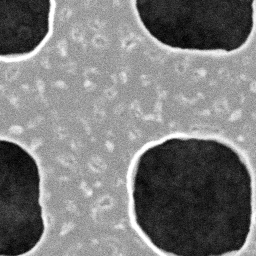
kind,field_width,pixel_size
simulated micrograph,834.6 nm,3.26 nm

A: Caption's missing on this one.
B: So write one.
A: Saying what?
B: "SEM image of holes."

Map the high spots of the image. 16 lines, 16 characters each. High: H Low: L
LLLHHHHHHLLLLLLL
LLLHHHHHHLLLLLLL
LLLHHHHHHHLLLLLH
LHHHHHHHHHHHHHHH
HHHHHHHHHHHHHHHH
HHHHHHHHHHHHHHHH
HHHHHHHHHHHHHHHH
HHHHHHHHHHHHHHHH
HHHHHHHHHHHHHHHH
LLHHHHHHHLLLLLLH
LLHHHHHHLLLLLLLL
LLHHHHHHLLLLLLLL
LLHHHHHHLLLLLLLL
LLLHHHHHLLLLLLLL
LLLHHHHHHLLLLLLL
LLHHHHHHHHLLLLLH